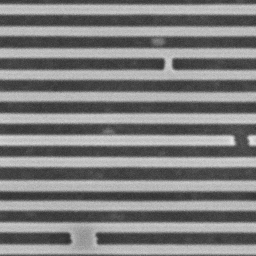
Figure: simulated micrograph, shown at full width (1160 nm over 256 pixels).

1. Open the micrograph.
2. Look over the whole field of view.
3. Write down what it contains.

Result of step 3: parallel lines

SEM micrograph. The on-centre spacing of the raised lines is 98.9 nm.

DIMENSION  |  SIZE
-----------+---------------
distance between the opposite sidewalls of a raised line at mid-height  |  39.1 nm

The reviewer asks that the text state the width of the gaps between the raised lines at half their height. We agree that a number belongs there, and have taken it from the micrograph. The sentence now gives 0.0606 micrometres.